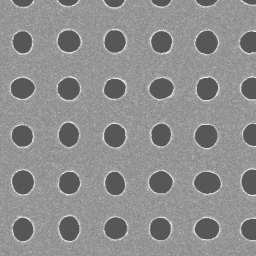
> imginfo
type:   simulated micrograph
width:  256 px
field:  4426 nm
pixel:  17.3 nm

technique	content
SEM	a regular array of holes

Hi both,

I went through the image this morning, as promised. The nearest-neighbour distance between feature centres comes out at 792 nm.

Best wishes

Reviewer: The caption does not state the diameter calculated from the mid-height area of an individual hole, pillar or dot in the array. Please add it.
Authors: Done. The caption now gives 0.386 microns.